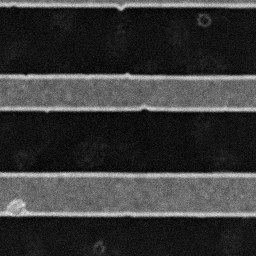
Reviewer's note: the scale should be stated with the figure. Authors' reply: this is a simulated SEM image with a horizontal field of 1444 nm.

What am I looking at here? one or a few lines or trenches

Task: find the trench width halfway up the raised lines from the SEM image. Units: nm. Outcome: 386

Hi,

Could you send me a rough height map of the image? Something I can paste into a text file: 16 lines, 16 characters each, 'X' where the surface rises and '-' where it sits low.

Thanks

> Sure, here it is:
----------------
----------------
----------------
----------------
----------------
XXXXXXXXXXXXXXXX
XXXXXXXXXXXXXXXX
----------------
----------------
----------------
----------------
XXXXXXXXXXXXXXXX
XXXXXXXXXXXXXXXX
----------------
----------------
----------------